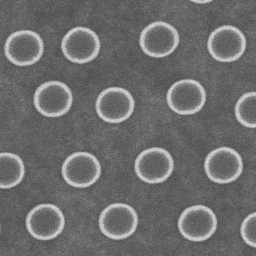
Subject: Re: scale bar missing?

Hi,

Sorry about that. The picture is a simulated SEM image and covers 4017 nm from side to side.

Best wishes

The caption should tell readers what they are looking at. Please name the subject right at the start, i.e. a regular array of raised bodies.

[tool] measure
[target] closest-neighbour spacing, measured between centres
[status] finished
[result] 994 nm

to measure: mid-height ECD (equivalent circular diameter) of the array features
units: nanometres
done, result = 542